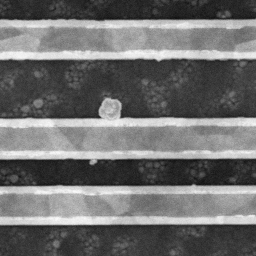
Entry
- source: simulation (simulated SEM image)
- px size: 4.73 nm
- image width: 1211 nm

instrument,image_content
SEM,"one or a few lines or trenches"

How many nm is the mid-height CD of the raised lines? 151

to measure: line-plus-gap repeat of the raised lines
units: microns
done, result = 0.392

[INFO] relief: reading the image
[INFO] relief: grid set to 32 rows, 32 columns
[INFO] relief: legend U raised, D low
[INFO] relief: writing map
DDDDDDDDDDDDDDDDDDDDDDDDDDDDDDDD
DDDDDDDDDDDDDDDDDDDDDDDDDDDDDDDD
DDDDDDDDDDDDDDDDDDDDDDDDDDDDDDDD
UUUUUUUUUUUUUUUUUUUUUUUUUUUUUUUU
UUUUUUUUUUUUUUUUUUUUUUUUUUUUUUUU
UUUUUUUUUUUUUUUUUUUUUUUUUUUUUUUU
UUUUUUUUUUUUUUUUUUUUUUUUUUUUUUUU
DDDDDDDDDDDDDDDDDDDDDDDDDDDDDDDD
DDDDDDDDDDDDDDDDDDDDDDDDDDDDDDDD
DDDDDDDDDDDDDDDDDDDDDDDDDDDDDDDD
DDDDDDDDDDDDDDDDDDDDDDDDDDDDDDDD
DDDDDDDDDDDDDDDDDDDDDDDDDDDDDDDD
DDDDDDDDDDDDDDDDDDDDDDDDDDDDDDDD
DDDDDDDDDDDDDDDDDDDDDDDDDDDDDDDD
DDDDDDDDDDDDDDDDDDDDDDDDDDDDDDDD
UUUUUUUUUUUUUUUUUUUUUUUUUUUUUUUU
UUUUUUUUUUUUUUUUUUUUUUUUUUUUUUUU
UUUUUUUUUUUUUUUUUUUUUUUUUUUUUUUU
UUUUUUUUUUUUUUUUUUUUUUUUUUUUUUUU
DDDUUDDDDDDDDDDDDDDDDDDDDDDDDDDD
DDDDDDDDDDDDDDDDDDDDDDDDDDDDDDDD
DDDDDDDDDDDDDDDDDDDDDDDDDDDDDDDD
DDDDDDDDDDDDDDDDDDDDDDDDDDDDDDDD
DDDDDDDDDDDDDDDDDDDDDDDDDDDDDDDD
UUUUUUUUUUUUUUUUUUUUUUUUUUUUUUUU
UUUUUUUUUUUUUUUUUUUUUUUUUUUUUUUU
UUUUUUUUUUUUUUUUUUUUUUUUUUUUUUUU
UUUUUUUUUUUUUUUUUUUUUUUUUUUUUUUU
DDDDDDDDDDDDDDDDDDDDDDDDDDDDDDDD
DDDDDDDDDDDDDDDDDDDDDDDDDDDDDDDD
DDDDDDDDDDDDDDDDDDDDDDDDDDDDDDDD
DDDDDDDDDDDDDDDDDDDDDDDDDDDDDDDD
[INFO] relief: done